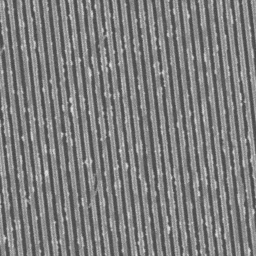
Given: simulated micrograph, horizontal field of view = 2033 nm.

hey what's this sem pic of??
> parallel lines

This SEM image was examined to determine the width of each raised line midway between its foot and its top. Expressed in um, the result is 0.0355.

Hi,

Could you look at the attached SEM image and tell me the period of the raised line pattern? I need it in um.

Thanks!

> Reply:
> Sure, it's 0.0686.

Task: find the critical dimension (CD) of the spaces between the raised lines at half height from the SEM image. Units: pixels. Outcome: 4.35